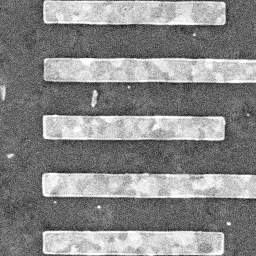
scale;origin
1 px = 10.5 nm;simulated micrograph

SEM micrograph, groups of lines, slits or small figures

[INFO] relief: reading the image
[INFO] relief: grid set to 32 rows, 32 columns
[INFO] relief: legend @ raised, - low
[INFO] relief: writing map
------@@@@@@@@@@@@@@@@@@@@@@----
------@@@@@@@@@@@@@@@@@@@@@@----
------@@@@@@@@@@@@@@@@@@@@@@----
--------------------------------
--------------------------------
--------------------------------
--------------------------------
------@@@@@@--@@@@@@@@@@--------
------@@@@@@@@@@@@@@@@@@@@@@@@@@
------@@@@@@@@@@@@@@@@@@@@@@@@@@
--------------------------------
--------------------------------
--------------------------------
--------------------------------
--------------------------------
------@@@@@@@@@@@@@@@@@@@@@@----
------@@@@@@@@@@@@@@@@@@@@@@----
--------------------------------
--------------------------------
--------------------------------
--------------------------------
--------------------------------
-----@@@@@@@@@@@@@@@@@@@@@@@@@@@
-----@@@@@@@@@@@@@@@@@@@@@@@@@@@
----------------@@@@@@---@@@@@@@
--------------------------------
--------------------------------
--------------------------------
--------------------------------
------@@@@@@@@@@@@@@@@@@@@@@----
------@@@@@@@@@@@@@@@@@@@@@@----
------@@@@@@@@@@@@@@@@@@@@@@----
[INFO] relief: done